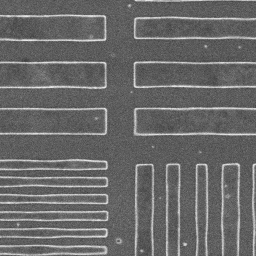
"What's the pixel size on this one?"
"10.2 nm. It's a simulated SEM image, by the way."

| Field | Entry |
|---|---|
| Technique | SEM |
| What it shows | groups of lines, slits or small figures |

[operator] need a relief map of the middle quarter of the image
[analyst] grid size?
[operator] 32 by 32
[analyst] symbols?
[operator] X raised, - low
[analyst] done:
XXXXXXXXXX--------XXXXXXXXXXXXXX
XXXXXXXXXX--------XXXXXXXXXXXXXX
XXXXXXXXXX--------XXXXXXXXXXXXXX
XXXXXXXXXX--------XXXXXXXXXXXXXX
XXXXXXXXXX--------XXXXXXXXXXXXXX
XXXXXXXXXX--------XXXXXXXXXXXXXX
--------------------------------
--------------------------------
--------------------------------
--------------------------------
--------------------------------
XXXXXXXXXX--------XXXXXXXXXXXXXX
XXXXXXXXXXX-------XXXXXXXXXXXXXX
XXXXXXXXXXX-------XXXXXXXXXXXXXX
XXXXXXXXXXX-------XXXXXXXXXXXXXX
XXXXXXXXXXX-------XXXXXXXXXXXXXX
XXXXXXXXXXX-------XXXXXXXXXXXXXX
------------------XXXXXXXXXXXX--
--------------------------------
--------------------------------
--------------------------------
--------------------------------
--------------------------------
--------------------------------
XXXXXXXXXX----------------------
XXXXXXXXXXX-------XXXX----XXX---
------------------XXXX----XXX---
------------------XXXX----XXX---
XXXXXXXXXXX-------XXXX----XXX---
XXXXXXXXXXX-------XXXX----XXX---
XXXXXXXXXXX-------XXXX----XXX---
------------------XXXX----XXX---